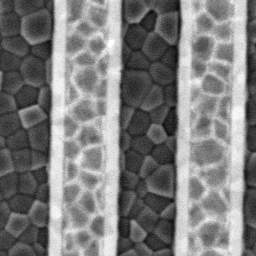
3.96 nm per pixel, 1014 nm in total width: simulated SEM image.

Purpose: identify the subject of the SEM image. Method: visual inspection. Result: one or a few lines or trenches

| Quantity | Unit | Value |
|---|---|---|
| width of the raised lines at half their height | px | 54.5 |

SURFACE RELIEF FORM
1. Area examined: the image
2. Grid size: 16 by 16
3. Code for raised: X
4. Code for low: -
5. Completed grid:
----XXX-----XXX-
----XXX-----XXX-
----XXX-----XXX-
----XXX-----XXX-
----XXX-----XXX-
----XXX-----XXX-
----XXX-----XXX-
----XXX-----XXX-
----XXX-----XXX-
----XXX----XXXX-
----XXX----XXXX-
----XXX----XXXX-
----XXX----XXXX-
---XXXX----XXXX-
---XXXX----XXXX-
---XXXX----XXXX-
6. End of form